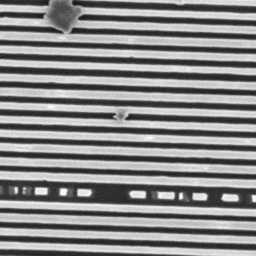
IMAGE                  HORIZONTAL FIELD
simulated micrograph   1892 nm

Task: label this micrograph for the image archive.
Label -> parallel lines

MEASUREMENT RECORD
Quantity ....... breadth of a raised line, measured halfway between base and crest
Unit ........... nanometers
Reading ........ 49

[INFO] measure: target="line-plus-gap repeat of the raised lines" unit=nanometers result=103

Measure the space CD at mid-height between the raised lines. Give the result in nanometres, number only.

49